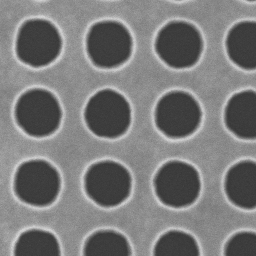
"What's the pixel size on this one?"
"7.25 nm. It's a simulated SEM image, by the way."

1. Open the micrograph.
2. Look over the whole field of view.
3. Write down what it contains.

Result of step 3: a regular array of holes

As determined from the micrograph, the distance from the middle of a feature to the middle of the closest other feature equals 506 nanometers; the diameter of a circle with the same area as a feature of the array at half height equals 339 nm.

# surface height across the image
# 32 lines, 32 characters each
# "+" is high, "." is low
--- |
++++++++++++++++++++++++++++++++
++++++++++++++++++++++++++++++++
++++..++++++++++++++++++++++++++
+++....++++.....++++....+++++...
++.....++++.....++++.....+++....
++......+++.....+++......+++....
++.....++++.....++++.....+++....
+++....++++.....++++.....++++...
+++++++++++++.++++++++++++++++..
++++++++++++++++++++++++++++++++
++++++++++++++++++++++++++++++++
+++...++++++..+++++++..+++++++..
++.....++++.....++++....+++++...
++......+++.....+++......+++....
++......+++.....+++......+++....
++.....++++.....+++......+++....
+++....+++++....++++....+++++...
++++++++++++++++++++++++++++++++
++++++++++++++++++++++++++++++++
++++++++++++++++++++++++++++++++
+++...++++++...++++++..+++++++..
++.....++++.....++++.....+++....
++.....++++.....+++......+++....
++.....++++.....+++......+++....
++.....++++.....++++.....+++....
++++..++++++...++++++...+++++...
++++++++++++++++++++++++++++++++
++++++++++++++++++++++++++++++++
++++++++++++++++++++++++++++++++
+++....++++....+++++....+++++...
++.....++++.....++++.....+++....
++......++......+++......+++....